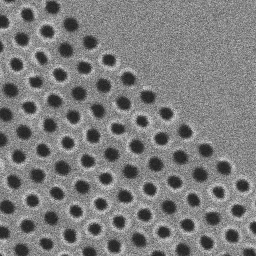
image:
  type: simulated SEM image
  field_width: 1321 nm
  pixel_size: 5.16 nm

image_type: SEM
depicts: a regular array of holes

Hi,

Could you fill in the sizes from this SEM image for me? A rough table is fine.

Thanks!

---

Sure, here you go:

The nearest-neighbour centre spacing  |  131 nanometers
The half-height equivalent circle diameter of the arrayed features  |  71.8 nanometres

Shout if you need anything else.